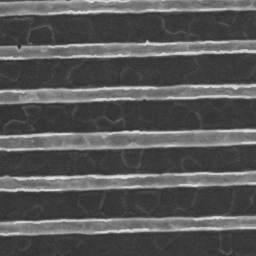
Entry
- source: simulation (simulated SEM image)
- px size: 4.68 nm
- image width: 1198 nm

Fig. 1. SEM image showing parallel lines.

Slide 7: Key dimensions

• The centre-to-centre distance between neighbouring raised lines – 0.205 microns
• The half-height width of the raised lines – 0.062 µm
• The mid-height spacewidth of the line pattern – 146 nanometres